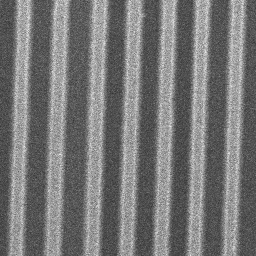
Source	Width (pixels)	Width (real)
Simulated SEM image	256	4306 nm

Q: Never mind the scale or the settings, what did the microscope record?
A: parallel lines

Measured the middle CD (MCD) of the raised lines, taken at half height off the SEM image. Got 0.265 microns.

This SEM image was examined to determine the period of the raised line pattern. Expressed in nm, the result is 599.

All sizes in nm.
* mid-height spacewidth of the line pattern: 323